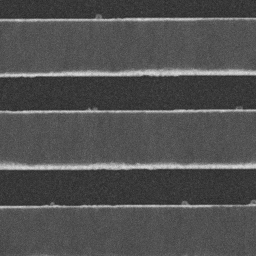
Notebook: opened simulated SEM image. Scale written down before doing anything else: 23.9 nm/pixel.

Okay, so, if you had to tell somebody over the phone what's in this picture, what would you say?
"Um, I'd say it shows lines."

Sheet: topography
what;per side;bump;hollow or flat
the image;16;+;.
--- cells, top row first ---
................
++++++++++++++++
++++++++++++++++
++++++++++++++++
++++++++++++++++
................
................
++++++++++++++++
++++++++++++++++
++++++++++++++++
++++++++++++++++
................
................
++++++++++++++++
++++++++++++++++
++++++++++++++++